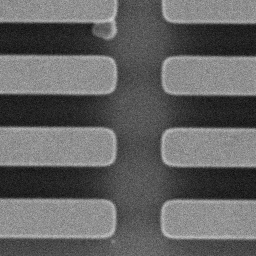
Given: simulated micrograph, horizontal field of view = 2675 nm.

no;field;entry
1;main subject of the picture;groups of lines, slits or small figures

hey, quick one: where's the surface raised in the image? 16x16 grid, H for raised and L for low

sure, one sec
HHHHHHHLLLHHHHHH
LLLLLLLLLLLLLLLL
LLLLLLLLLLLLLLLL
HHHHLLLLLLLLLLLL
HHHHHHHLLLHHHHHH
HHHHHHHLLLHHHHHH
LLLLLLLLLLLLLLLL
LLLLLLLLLLLLLLLL
HHHHHHHLLLHHHHHH
HHHHHHHLLLHHHHHH
LLLLLLLLLLLLLLLL
LLLLLLLLLLLLLLLL
HHHHHHLLLLLLLLLL
HHHHHHHLLLHHHHHH
HHHHHHHLLLHHHHHH
LLLLLLLLLLLLLLLL